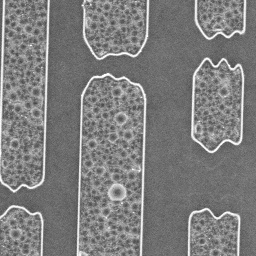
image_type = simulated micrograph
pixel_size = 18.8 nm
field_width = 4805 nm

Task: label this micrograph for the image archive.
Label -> one or a few lines or trenches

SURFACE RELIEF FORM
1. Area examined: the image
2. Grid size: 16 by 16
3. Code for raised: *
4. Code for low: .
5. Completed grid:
***..****...***.
***..****...***.
***..****.......
***...*.........
***.........***.
***..****...***.
***..****...***.
***..****...***.
***..****...***.
***..****.......
***..****.......
**...****.......
.....****.......
**...****...***.
***..****...***.
***..****...***.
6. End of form